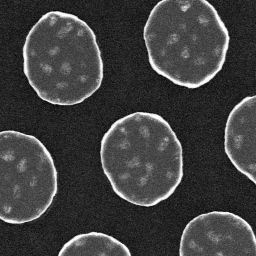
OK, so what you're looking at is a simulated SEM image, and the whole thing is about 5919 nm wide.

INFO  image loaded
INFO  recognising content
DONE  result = raised bodies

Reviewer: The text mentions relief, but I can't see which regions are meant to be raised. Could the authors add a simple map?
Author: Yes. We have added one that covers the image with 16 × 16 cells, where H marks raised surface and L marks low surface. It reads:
LLLLLLLLLLHHHLLL
LLHHHLLLLHHHHHLL
LLHHHHLLLHHHHHLL
LLHHHHLLLHHHHHLL
LLHHHHLLLLHHHHLL
LLHHHHLLLLLLLLLL
LLLLHLLLLLLLLLLH
LLLLLLLLHHLLLLHH
HHLLLLLHHHHLLLHH
HHHLLLHHHHHLLLHH
HHHLLLHHHHHLLLLH
HHHHLLLHHHHLLLLL
HHHLLLLLHHLLLLLL
HHLLLLLLLLLLLHHL
LLLLLLLLLLLHHHHH
LLLLHHHHLLLHHHHH